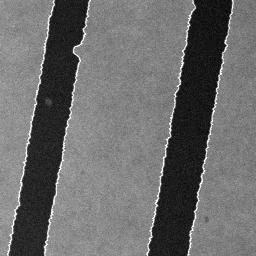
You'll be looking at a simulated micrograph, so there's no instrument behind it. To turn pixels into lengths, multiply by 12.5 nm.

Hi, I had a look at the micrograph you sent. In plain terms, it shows one or a few lines or trenches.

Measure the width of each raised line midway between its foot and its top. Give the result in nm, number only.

476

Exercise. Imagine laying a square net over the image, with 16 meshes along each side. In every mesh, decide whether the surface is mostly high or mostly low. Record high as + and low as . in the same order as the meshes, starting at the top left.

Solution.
...+++......+++.
...++.......++..
...++.......++..
...++......+++..
...++......+++..
..+++......+++..
..++.......++...
..++.......++...
..++.......++...
..++......+++...
.+++......+++...
.+++......+++...
.++.......++....
.++.......++....
.++......+++....
.++......+++....